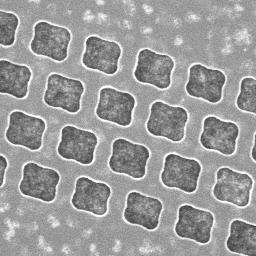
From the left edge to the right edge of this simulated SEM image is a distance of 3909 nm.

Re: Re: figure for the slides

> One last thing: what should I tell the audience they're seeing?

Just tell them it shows a regular array of holes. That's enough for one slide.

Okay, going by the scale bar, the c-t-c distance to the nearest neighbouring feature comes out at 53.2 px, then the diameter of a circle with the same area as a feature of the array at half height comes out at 582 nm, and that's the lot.